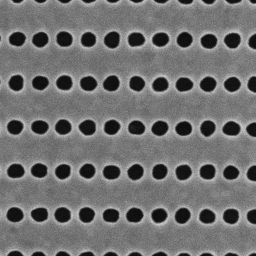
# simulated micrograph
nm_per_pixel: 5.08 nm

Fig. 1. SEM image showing a regular array of holes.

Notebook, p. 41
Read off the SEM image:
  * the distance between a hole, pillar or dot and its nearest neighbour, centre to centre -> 0.12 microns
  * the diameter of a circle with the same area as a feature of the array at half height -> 82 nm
